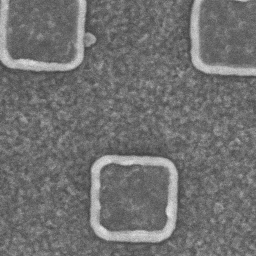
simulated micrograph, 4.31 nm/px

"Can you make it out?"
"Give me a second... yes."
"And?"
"raised bodies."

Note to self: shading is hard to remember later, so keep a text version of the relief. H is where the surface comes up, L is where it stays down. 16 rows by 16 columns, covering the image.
HHHHHLLLLLLLHHHH
HHHHHLLLLLLLHHHH
HHHHHLLLLLLLHHHH
HHHHHLLLLLLLHHHH
LLLLLLLLLLLLLLLH
LLLLLLLLLLLLLLLL
LLLLLLLLLLLLLLLL
LLLLLLLLLLLLLLLL
LLLLLLLLLLLLLLLL
LLLLLLLLLLLLLLLL
LLLLLLHHHHHLLLLL
LLLLLLHHHHHLLLLL
LLLLLLHHHHHLLLLL
LLLLLLHHHHHLLLLL
LLLLLLHHHHLLLLLL
LLLLLLLLLLLLLLLL